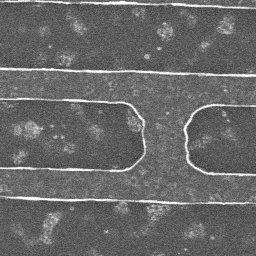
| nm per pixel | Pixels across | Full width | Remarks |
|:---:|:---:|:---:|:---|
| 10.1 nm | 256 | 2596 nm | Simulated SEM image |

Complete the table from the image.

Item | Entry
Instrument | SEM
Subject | one or a few lines or trenches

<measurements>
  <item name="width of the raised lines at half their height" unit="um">0.316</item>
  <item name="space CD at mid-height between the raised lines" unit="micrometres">0.68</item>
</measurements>